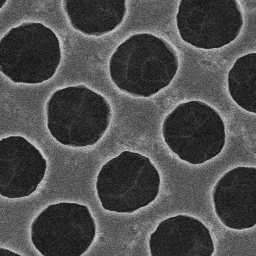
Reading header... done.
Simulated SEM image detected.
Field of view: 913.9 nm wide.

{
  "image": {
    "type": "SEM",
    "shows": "holes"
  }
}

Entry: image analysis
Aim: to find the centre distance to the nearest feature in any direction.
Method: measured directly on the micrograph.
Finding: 297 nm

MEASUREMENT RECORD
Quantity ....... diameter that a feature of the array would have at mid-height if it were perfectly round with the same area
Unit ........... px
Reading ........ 61.6